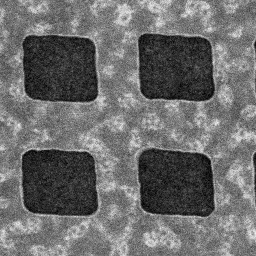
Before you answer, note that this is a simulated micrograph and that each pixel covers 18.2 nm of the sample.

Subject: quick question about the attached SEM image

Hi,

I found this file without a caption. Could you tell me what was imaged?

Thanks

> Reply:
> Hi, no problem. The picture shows holes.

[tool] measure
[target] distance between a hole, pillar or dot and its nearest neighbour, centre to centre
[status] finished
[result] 2080 nm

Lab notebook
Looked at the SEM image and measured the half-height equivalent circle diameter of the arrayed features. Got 1410 nanometers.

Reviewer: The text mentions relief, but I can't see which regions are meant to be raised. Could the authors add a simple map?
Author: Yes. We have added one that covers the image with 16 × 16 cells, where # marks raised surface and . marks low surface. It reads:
################
################
##....###....###
#.....###....###
#.....###....###
##....###....###
################
################
################
##...####...####
#.....###....###
#.....###....###
#.....###....###
############.###
################
################